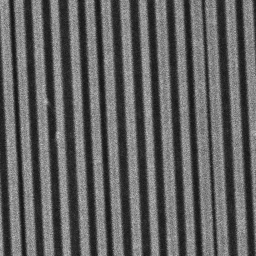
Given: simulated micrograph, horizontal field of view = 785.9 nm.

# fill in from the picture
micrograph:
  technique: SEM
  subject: parallel lines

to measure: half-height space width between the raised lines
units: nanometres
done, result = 23.3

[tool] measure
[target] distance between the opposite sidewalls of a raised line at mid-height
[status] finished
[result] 0.0306 micrometres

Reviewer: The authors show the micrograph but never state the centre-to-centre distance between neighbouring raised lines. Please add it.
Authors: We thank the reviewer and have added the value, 53.4 nm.